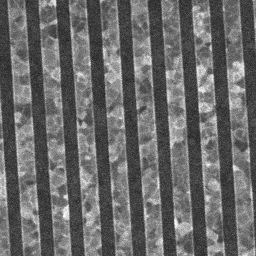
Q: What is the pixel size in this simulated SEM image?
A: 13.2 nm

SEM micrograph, parallel lines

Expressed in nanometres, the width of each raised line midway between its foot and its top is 223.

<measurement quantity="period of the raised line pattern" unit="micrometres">0.406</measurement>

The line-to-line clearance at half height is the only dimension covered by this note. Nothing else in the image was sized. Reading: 184 nanometers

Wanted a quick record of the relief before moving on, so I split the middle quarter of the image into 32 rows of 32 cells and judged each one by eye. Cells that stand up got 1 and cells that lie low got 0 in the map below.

00111110001111000011110000111000
00011110001111000011110000111000
00011110001111000011110000111100
00011110001111000011110000111100
00011110001111000011110000111100
00011110001111000011110000111100
00011110000111000011110000111100
00011110000111000011110000111100
00011110000111100011110000111100
00011110000111100011110000111100
00011110000111100011110000111100
00011110000111100011110000111100
00011110000111100011110000111100
00011110000111100001111000111100
00001110000111100001111000111100
00001110000111100001111000111110
00011110000111100001111000011110
00001110000111100001111000011110
00001110000111100001111000011110
00001111000111100001111000011110
00001111000111100001111000011110
00001111000111100001111000011110
00001111000111100001111000011110
00001111000111100001111000011110
00001111000011110001111000011110
00001111000011100001111000011110
00001111000011110001111000011110
00001111000011110000111000011110
00001111000011110000111000011110
00001111000011110000111100011110
10001111000011110000111100011110
10001111000011110000111100011110